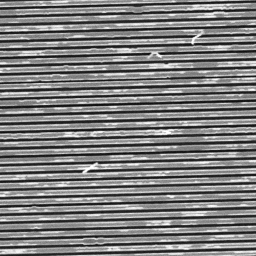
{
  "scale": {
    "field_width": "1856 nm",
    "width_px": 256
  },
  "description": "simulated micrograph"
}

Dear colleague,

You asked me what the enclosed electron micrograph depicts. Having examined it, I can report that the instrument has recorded parallel lines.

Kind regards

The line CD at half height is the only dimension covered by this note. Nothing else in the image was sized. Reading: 34.4 nm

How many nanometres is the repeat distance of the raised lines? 59.7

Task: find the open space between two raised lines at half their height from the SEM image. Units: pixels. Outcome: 2.87